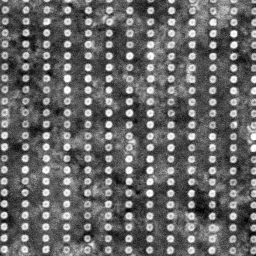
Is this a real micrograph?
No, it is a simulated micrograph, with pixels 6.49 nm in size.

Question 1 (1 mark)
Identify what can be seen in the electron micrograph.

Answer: a regular array of raised bodies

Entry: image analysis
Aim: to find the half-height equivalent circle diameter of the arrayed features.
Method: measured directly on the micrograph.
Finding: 38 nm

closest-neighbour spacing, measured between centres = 73.1 nm